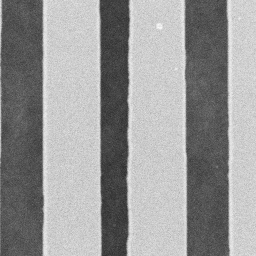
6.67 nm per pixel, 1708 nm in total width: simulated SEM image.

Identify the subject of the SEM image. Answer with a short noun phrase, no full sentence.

lines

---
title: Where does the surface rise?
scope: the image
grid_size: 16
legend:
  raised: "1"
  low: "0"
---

0001110011110011
0001110011110011
0001110011110011
0001110011110011
0001110011110011
0001110011110011
0001110011110011
0001110011110011
0001110011110011
0001110011110011
0001110011110011
0001110011110011
0001110011110011
0001110011110011
0001110011110011
0001110011110011